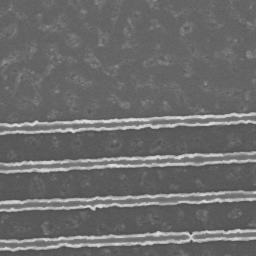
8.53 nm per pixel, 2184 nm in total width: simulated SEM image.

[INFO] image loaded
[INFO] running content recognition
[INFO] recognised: parallel lines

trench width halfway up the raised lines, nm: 242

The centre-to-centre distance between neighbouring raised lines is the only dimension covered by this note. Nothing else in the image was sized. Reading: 329 nanometers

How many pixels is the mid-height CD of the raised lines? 9.86